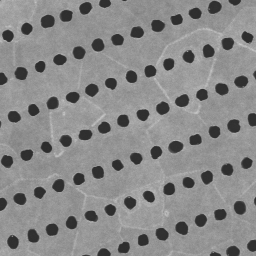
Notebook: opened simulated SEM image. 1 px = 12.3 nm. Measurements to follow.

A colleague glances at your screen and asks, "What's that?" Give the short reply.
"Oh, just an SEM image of a regular array of holes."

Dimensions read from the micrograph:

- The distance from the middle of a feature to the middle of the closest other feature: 249 nm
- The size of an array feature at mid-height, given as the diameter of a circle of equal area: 148 nm